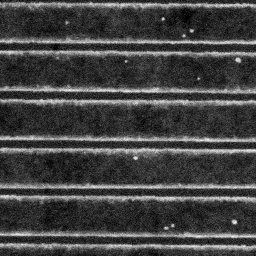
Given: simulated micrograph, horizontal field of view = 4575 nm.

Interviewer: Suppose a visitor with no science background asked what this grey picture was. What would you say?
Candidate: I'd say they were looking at lines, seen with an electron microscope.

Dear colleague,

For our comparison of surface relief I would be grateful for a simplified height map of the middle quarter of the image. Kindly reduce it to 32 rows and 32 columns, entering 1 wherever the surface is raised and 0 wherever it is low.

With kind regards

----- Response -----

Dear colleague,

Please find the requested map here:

11111111111111111111111111111111
11111111111111111111111111111111
11111111111111111111111111111111
11111111111111111111111111111111
11111111111111111111111111111111
11111111111111111111111111111111
00001111111111111111111111111111
00000000000000000000000000000000
00000000000000000000000000000000
11100010000000000000000000000000
11111111111111111111111111111111
11111111111111111111111111111111
11111111111111111111111111111111
11111111111111111111111111111111
11111111111111111111111111111111
11111111111111111111111111111111
11111111111111111111111111111111
11111111111111111111111111111111
11111111111111111111111111111111
00000000000000000000000000000000
00000000000000000000000000000000
00000000000000000000000000000000
11111111111111111111111111111111
11111111111111111111111111111111
11111111111111111111111111111111
11111111111111111111111111111111
11111111111111111111111111111111
11111111111111111111111111111111
11111111111111111111111111111111
11111111111111111111111111111111
10011111111111111111111110000000
00000000000000000000000000000000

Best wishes